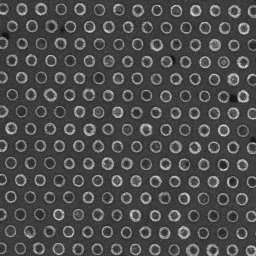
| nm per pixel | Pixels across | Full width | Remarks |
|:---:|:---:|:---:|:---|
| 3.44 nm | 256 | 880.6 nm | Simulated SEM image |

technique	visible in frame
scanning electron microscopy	a regular array of raised bodies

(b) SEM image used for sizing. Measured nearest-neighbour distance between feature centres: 65.2 nm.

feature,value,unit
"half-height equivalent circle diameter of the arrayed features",38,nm